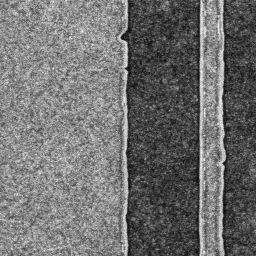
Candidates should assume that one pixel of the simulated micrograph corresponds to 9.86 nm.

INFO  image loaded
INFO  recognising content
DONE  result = one or a few lines or trenches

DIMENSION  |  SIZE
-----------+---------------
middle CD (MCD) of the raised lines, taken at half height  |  20 pixels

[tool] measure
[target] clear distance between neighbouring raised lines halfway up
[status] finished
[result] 748 nm